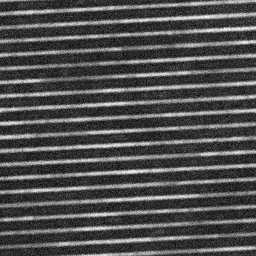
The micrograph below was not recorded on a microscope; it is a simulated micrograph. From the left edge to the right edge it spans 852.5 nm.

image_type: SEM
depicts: parallel lines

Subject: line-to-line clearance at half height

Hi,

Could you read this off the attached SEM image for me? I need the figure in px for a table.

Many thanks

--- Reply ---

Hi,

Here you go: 11.1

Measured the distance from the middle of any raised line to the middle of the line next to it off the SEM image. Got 45.7 nanometers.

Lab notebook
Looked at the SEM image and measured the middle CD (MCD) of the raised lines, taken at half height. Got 7.9 nm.